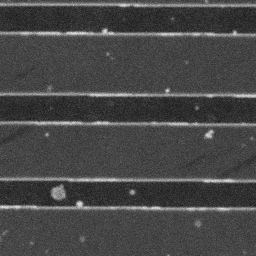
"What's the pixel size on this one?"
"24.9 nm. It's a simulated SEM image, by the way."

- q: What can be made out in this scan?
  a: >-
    lines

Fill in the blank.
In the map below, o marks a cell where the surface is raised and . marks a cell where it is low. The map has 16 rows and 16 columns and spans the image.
................
................
oooooooooooooooo
oooooooooooooooo
oooooooooooooooo
oooooooooooooooo
................
................
oooooooooooooooo
oooooooooooooooo
oooooooooooooooo
................
................
oooooooooooooooo
oooooooooooooooo
oooooooooooooooo